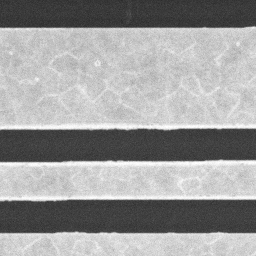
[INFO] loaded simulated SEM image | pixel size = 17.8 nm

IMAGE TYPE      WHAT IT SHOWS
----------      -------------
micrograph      lines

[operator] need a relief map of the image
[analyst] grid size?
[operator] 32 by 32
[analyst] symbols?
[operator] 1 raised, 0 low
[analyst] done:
00000000000000000000000000000000
00000000000000000000000000000000
00000000000000000000000000000000
00000000000000000000000000000001
11111111111111111111111111111111
11111111111111111111111111111111
11111111111111111111111111111111
11111111111111111111111111111111
11111111111111111111111111111111
11111111111111111111111111111111
11111111111111111111111111111111
11111111111111111111111111111111
11111111111111111111111111111111
11111111111111111111111111111111
11111111111111111111111111111111
11111111111111111111111111111111
00000000000000000000000000000000
00000000000000000000000000000000
00000000000000000000000000000000
00000000000000000000000000000000
11111111111111111111111111111111
11111111111111111111111111111111
11111111111111111111111111111111
11111111111111111111111111111111
11111111111111111111111111111111
00000000000000000000000000000000
00000000000000000000000000000000
00000000000000000000000000000000
00000000000000000000000000000000
11111111111111111111111111111111
11111111111111111111111111111111
11111111111111111111111111111111